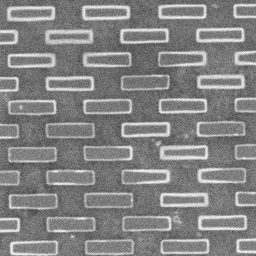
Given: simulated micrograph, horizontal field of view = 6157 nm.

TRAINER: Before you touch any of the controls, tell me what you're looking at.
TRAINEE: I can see groups of lines, slits or small figures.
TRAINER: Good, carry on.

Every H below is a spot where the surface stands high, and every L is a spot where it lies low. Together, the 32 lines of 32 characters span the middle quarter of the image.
LLLLLLLLLLLLLLLLLLLLLLLLLLLLLLLL
LLLLLLLLLLLLLLLLLLLLLLLLLLLLLLLL
LLLLLLLLLLLLLLLLLLLLLLLLLLLLLLLL
LLLHHHHLLLLLLLHHHHHHHHHHHHLLLLLL
HHHHHHHLLLLLLLHHHHHHHHHHHHLLLLLL
HHHHHHHLLLLLLLHHHHHHHHHHHHLLLLLL
LLLLLLLLLLLLLLLLLLLLLLLLLLLLLLLL
LLLLLLLLLLLLLLLLLLLLLLLLLLLLLLLL
LLLLLLLLLLLLLLLLLLLLLLLLLLLLLLLL
LLLLLHHHHHHHHHHHHLLLLLLLHHHHHHHH
LLLLLHHHHHHHHHHHHLLLLLLLHHHHHHHH
LLLLLHHHHHHHHHHHHLLLLLLLHHHHHHHH
LLLLLLLLLLLLLLLLLLLLLLLLLLLLLLLL
LLLLLLLLLLLLLLLLLLLLLLLLLLLLLLLL
LLLLLLLLLLLLLLLLLLLLLLLLLLLLLLLL
HHHHHHHLLLLLLLLHHHHHHHHHHHLLLLLL
HHHHHHHLLLLLLLLHHHHHHHHHHHLLLLLL
HHHHHHHLLLLLLLLHHHHHHHHHHHLLLLLL
LLLLLLLLLLLLLLLLLLLLLLLLLLLLLLLL
LLLLLLLLLLLLLLLLLLLLLLLLLLLLLLLL
LLLLLLLLLLLLLLLLLLLLLLLLLLLLLLLL
LLLLLHHHHHHHHHHHHLLLLLLLHHHHHHHH
LLLLLHHHHHHHHHHHHLLLLLLLHHHHHHHH
LLLLLHHHHHHHHHHHHLLLLLLLLLLLLLLL
LLLLLLLLLLLLLLLLLLLLLLLLLLLLLLLL
LLLLLLLLLLLLLLLLLLLLLLLLLLLLLLLL
LLLLLLLLLLLLLLLLLLLLLLLLLLLLLLLL
HHHHHHHLLLLLLLLHHHHHHHHHHHLLLLLL
HHHHHHHLLLLLLLLHHHHHHHHHHHLLLLLL
HHHHHHHLLLLLLLLHHHHHHHHHHLLLLLLL
LLLLLLLLLLLLLLLLLLLLLLLLLLLLLLLL
LLLLLLLLLLLLLLLLLLLLLLLLLLLLLLLL